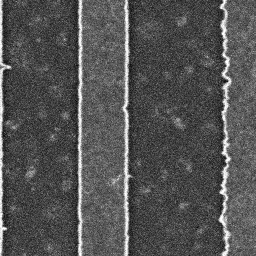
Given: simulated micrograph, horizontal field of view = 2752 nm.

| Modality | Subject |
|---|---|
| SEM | one or a few lines or trenches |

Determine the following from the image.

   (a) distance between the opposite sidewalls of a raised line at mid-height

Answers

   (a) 504 nanometers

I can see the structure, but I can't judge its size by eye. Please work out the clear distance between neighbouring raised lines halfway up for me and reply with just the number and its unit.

987 nanometres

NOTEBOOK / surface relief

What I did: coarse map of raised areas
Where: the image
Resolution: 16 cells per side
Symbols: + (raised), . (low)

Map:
.....+++......++
.....+++......++
.....+++......++
.....+++......++
.....+++......++
.....+++......++
.....+++......++
.....+++......++
.....+++......++
.....+++......++
.....+++......++
.....+++......++
.....+++......++
.....+++......++
.....+++......++
.....+++......++